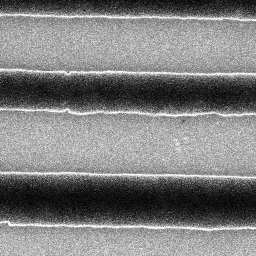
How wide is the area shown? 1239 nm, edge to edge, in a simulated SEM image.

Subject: one or a few lines or trenches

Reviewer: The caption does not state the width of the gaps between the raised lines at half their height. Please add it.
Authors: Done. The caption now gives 0.277 micrometres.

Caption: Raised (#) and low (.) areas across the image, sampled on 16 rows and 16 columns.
################
................
................
................
#########.......
################
################
................
................
................
................
################
################
################
................
................